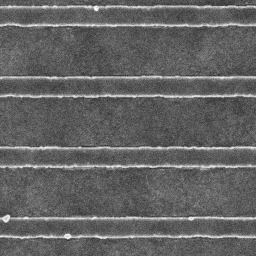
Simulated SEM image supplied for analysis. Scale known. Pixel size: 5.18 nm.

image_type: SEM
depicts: lines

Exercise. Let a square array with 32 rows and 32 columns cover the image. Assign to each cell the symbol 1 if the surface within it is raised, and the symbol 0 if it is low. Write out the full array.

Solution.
00000000000000000000000000000000
11111111111111111111111111111111
11111111111111111111111111111111
00000000000000000000000000000000
00000000000000000000000000000000
00000000000000000000000000000000
00000000000000000000000000000000
00000000000000000000000000000000
00000000000000000000000000000000
00000000000000000000000000000000
11111111111111111111111111111111
11111111111111111111111111111111
00000000000000000000000000000000
00000000000000000000000000000000
00000000000000000000000000000000
00000000000000000000000000000000
00000000000000000000000000000000
00000000000000000000000000000000
10110110000011000110011010000111
11111111111111111111111111111111
11111111111111111111111111111111
00000000000000000000000000000000
00000000000000000000000000000000
00000000000000000000000000000000
00000000000000000000000000000000
00000000000000000000000000000000
00000000000000000000000000000000
11111111111111111111111111111111
11111111111111111111111111111111
11111111111111111111111111111111
00000000000000000000000000000000
00000000000000000000000000000000